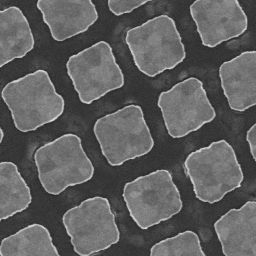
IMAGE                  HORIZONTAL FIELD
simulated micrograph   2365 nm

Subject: a regular array of raised bodies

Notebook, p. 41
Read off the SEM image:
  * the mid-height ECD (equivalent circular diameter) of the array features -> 512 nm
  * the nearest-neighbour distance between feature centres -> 622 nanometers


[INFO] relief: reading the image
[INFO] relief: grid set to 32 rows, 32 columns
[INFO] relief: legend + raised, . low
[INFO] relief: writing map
.....+++++++..++++......++++++..
+++..+++++++..++........++++++..
+++...++++++.......++...+++++++.
++++..+++++......+++++...++++++.
++++...++.......++++++...+++++..
++++........+...+++++++...+.....
+++.......++++..+++++++........+
+........+++++...++++++......+++
........+++++++..++++.......++++
...+++...++++++.............++++
.++++++..++++++.......+++...++++
+++++++...+++........+++++..++++
.+++++++..++........++++++...+++
.+++++++........+...+++++++..++.
..+++++......+++++..+++++++.....
..+++.......++++++...++++.......
............+++++++..+++.......+
.......+++..+++++++............+
.....+++++...++++++.......+++..+
....+++++++..++++.......+++++...
++...++++++...+........+++++++..
++...+++++++.......++...++++++..
+++..++++++......+++++..++++++..
+++...++........++++++..+++++...
++++...........+++++++...+++....
++++......++++..+++++++........+
++......++++++..++++++.......+++
........++++++...+++.......+++++
...+++..+++++++............+++++
.+++++...++++++.......++++.+++++
+++++++..+++++......+++++...++++
+++++++...++.......++++++...++++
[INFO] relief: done